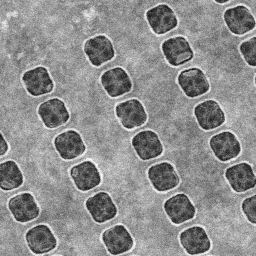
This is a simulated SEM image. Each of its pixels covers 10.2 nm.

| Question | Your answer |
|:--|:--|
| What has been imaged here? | a regular array of holes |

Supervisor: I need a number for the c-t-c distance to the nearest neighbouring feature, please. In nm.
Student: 359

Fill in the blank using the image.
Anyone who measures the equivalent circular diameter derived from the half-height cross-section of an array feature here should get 314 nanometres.